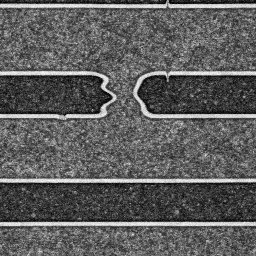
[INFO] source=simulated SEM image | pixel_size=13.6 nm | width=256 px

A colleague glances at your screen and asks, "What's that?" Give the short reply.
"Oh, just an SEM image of one or a few lines or trenches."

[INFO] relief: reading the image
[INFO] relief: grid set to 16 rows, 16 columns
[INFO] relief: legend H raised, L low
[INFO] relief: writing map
HHHHHHHHHHHHHHHH
HHHHHHHHHHHHHHHH
HHHHHHHHHHHHHHHH
HHHHHHHHHHHHHHHH
HHHHHHHHHHHHHHHH
LLLLLLLHHLLLLLLL
LLLLLLLHHLLLLLLL
HHHHHHHHHHHHHHHH
HHHHHHHHHHHHHHHH
HHHHHHHHHHHHHHHH
HHHHHHHHHHHHHHHH
LLLLLLLLLLLLLLLL
LLLLLLLLLLLLLLLL
LLLLLLLLLLLLLLLL
HHHHHHHHHHHHHHHH
HHHHHHHHHHHHHHHH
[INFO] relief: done